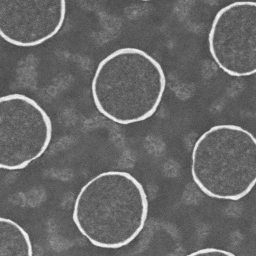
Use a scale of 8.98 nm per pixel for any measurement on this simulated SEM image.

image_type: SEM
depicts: raised bodies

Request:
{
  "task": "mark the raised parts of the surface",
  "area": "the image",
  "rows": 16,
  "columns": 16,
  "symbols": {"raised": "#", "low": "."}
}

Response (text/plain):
####..........##
####.........###
.##..........###
.......##....###
......####....##
......####......
##....####......
###....##.......
###..........###
###.........####
............####
......###...####
.....####.......
.....####.......
#....####.......
##..............